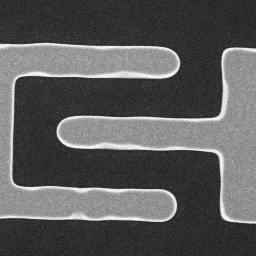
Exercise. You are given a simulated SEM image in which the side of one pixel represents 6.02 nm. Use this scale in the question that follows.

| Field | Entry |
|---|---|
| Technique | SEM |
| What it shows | groups of lines, slits or small figures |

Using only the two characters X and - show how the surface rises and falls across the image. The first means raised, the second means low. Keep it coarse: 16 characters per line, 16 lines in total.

----------------
----------------
----------------
XXXXXXXXXXX---XX
XXXXXXXXXXX---XX
X-------------XX
X-------------XX
X---XXXXXXXXXXXX
X---XXXXXXXXXXXX
X------------XXX
X-------------XX
X-------------XX
XXXXXXXXXXX---XX
XXXXXXXXXXX---XX
----------------
----------------